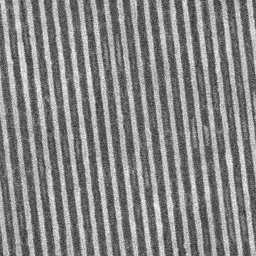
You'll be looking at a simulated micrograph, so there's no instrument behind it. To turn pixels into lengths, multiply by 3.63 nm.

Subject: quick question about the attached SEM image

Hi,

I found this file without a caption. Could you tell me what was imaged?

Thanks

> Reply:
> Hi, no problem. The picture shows parallel lines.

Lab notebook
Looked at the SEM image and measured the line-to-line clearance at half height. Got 8.18 px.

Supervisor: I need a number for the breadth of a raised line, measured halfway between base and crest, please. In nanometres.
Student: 16.7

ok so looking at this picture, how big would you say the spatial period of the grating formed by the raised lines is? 46.9 nanometres